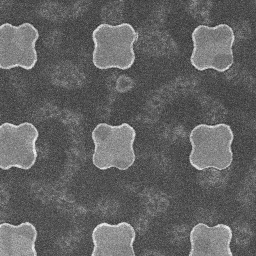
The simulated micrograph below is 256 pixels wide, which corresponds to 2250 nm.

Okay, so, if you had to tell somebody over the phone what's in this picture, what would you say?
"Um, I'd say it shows raised bodies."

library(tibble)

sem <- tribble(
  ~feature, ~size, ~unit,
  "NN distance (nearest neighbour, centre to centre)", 864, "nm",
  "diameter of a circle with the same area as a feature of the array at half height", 405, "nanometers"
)